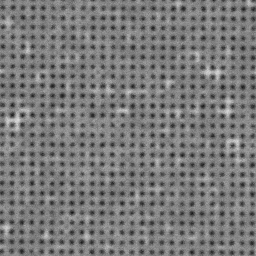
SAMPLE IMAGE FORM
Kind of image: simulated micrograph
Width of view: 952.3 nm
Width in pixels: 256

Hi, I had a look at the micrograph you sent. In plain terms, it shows a regular array of holes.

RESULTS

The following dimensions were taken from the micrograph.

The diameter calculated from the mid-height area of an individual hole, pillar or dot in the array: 13.3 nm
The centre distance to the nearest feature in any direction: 35.9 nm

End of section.